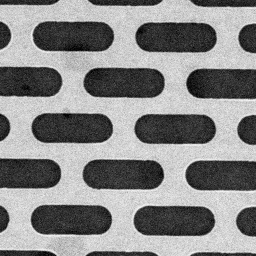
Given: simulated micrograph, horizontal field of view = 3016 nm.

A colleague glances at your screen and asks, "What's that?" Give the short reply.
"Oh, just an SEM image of groups of lines, slits or small figures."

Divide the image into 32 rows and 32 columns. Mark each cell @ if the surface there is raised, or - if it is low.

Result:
-------@@@@@--------@@@@--------
@@@@@@@@@@@@@@@@@@@@@@@@@@@@@@@@
@@@@@@@@@@@@@@@@@@@@@@@@@@@@@@@@
-@@@----------@@@----------@@@--
-@@@----------@@@----------@@@--
-@@@----------@@@----------@@@--
@@@@@@-@@---@@@@@@@-------@@@@@-
@@@@@@@@@@@@@@@@@@@@@@@@@@@@@@@@
-------@@@@@-------@@@@@@--@@-@@
--------@@@----------@@---------
--------@@-----------@@---------
-------@@@@---------@@@@--------
@@@@@@@@@@@@@@@@@@@@@@@@@@@@@---
@@@@@@@@@@@@@@@@@@@@@@@@@@@@@@@@
-@@@@--------@@@@@--------@@@@@-
-@@@----------@@@----------@@@--
-@@@----------@@@----------@@@--
@@@@@---------@@@---------@@@@--
@@@@@@@@@@@@@@@@@@@@@@@@@@@@@@@@
@@@@@@@@@@@@@@@@@@@@@@@@@@@@@@@@
-------@@@@---------@@@@--------
--------@@-----------@@---------
--------@@-----------@@---------
-------@@@@---------@@@@--------
@@@@@@@@@@@@@@@@@@@@@@@@@@@@@@@@
@@@@@@------@@@@@@@@@@@@@@@@@@@@
-@@@----------@@@----------@@@--
-@@@----------@@@----------@@---
-@@@----------@@@----------@@@--
@@@@@@@@@@@@@@@@@@@------@@@@@@-
@@@@@@@@@@@@@@@@@@@@@@@@@@@@@@@@
-------@@@@--------@@@@@-------@